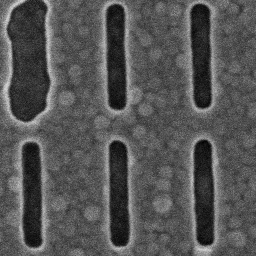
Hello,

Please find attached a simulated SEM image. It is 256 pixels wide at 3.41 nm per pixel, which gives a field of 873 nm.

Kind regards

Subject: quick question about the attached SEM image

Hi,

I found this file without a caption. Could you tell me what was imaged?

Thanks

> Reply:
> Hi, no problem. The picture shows holes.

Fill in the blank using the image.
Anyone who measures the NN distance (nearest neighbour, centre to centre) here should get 291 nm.